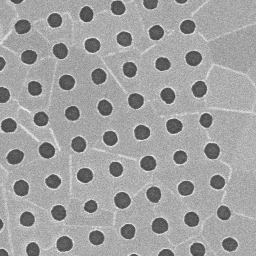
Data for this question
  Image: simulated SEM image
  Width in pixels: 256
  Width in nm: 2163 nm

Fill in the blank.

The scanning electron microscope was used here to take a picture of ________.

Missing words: a regular array of holes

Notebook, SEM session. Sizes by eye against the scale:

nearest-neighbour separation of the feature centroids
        0.265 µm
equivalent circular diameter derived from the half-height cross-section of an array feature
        136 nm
